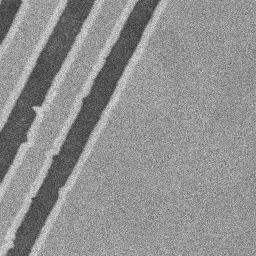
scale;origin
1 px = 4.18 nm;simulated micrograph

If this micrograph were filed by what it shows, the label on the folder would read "one or a few lines or trenches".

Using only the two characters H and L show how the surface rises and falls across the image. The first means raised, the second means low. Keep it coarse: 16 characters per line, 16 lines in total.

LHHHLLHHLLHHHHHH
LHHLLLHLLLHHHHHH
LHHLLHHLLHHHHHHH
HHLLHHLLLHHHHHHH
HHLLHHLLHHHHHHHH
HLLHHLLLHHHHHHHH
HLLHHLLHHHHHHHHH
LLHHLLHHHHHHHHHH
LLHHLLHHHHHHHHHH
LHHLLHHHHHHHHHHH
LHHLLHHHHHHHHHHH
HHLLHHHHHHHHHHHH
HHLLHHHHHHHHHHHH
HLLHHHHHHHHHHHHH
HLLHHHHHHHHHHHHH
LLHHHHHHHHHHHHHH